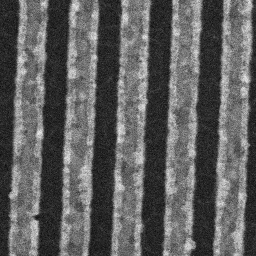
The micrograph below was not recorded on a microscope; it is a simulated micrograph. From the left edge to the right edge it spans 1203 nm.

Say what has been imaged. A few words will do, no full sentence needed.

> parallel lines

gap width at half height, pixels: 25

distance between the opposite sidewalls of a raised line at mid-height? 122 nanometers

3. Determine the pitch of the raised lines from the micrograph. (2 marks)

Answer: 0.241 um